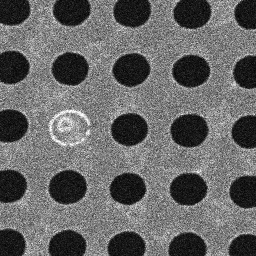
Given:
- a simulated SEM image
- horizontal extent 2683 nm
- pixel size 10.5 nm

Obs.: a regular array of holes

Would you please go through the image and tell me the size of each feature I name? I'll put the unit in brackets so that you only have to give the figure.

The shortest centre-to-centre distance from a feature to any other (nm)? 622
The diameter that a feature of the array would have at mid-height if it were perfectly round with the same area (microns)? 0.373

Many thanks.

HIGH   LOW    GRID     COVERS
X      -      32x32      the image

----XXX----XXX-----XXX----XXXX--
----XXX----XXX-----XXX----XXX---
---XXXX----XXX----XXXX----XXX---
XXXXXXXXXXXXXXXXXXXXXXX--XXXXX--
XXXXXXXXXXXXXXXXXXXXXXXXXXXXXXXX
XXXXXXXXXXXXXXXXXXXXXXXXXXXXXXXX
--XXXXXXXXXXXXXXXXXXXXXXXXXXXXXX
---XXXX----XXXX---XXXX----XXXX--
----XX-----XXX-----XXX----XXX---
---XXXX----XXX-----XXX----XXX---
XXXXXXXX--XXXXX---XXXX---XXXXX--
XXXXXXXXXXXXXXXXXXXXXXXXXXXXXXXX
XXXXXXXXXXXXXXXXXXXXXXXXXXXXXXXX
XXXXXXXXXXXXXXXXXXXXXXXXXXXXXXXX
---XXXXXXXXXXXX---XXXXX--XXXXXX-
----XXXXXXXXXX----XXX-----XXX---
---XXXXXXXXXXX----XXX-----XXX---
--XXXXXXXXXXXX----XXXX----XXX---
XXXXXXXXXXXXXXXXXXXXXXXXXXXXXXXX
XXXXXXXXXXXXXXXXXXXXXXXXXXXXXXXX
XXXXXXXXXXXXXXXXXXXXXXXXXXXXXXXX
--XXXXXX--XXXXXXXXXXXXXXXXXXXXXX
---XXX-----XXX----XXXX---XXXX---
---XXX-----XXX----XXX-----XXX---
---XXX----XXXX----XXX-----XXX---
XXXXXXXX-XXXXXX--XXXXX--XXXXX---
XXXXXXXXXXXXXXXXXXXXXXXXXXXXXXXX
XXXXXXXXXXXXXXXXXXXXXXXXXXXXXXXX
XXXXXXXXXXXXXXXXXXXXXXXXXXXXXXXX
---XXXX---XXXX----XXXX---XXXXX--
---XXX-----XXX----XXX-----XXX---
---XXX-----XX-----XXX-----XXX---